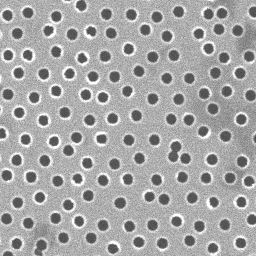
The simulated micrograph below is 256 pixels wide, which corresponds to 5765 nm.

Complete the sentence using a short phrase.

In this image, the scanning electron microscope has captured a regular array of holes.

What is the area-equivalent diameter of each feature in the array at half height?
0.255 um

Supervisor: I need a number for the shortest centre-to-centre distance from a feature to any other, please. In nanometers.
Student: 443